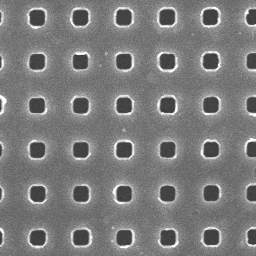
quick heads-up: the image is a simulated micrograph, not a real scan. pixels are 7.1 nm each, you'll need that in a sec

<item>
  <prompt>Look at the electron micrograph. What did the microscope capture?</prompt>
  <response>a regular array of holes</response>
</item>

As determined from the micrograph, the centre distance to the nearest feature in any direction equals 308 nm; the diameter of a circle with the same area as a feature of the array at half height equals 116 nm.